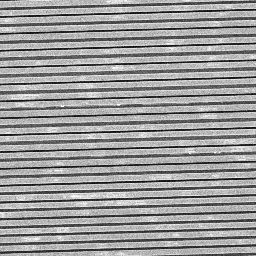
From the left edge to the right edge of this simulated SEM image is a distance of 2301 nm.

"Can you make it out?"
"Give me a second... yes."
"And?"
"parallel lines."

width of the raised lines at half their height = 50.5 nm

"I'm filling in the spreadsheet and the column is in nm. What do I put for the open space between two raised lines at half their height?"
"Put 24.7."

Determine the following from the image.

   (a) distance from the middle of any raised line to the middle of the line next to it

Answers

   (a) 75.6 nm